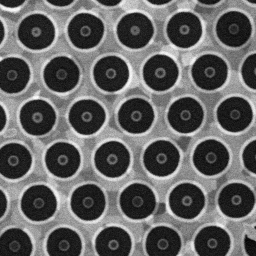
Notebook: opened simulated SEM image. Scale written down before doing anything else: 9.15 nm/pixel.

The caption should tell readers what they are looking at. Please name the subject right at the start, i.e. an array of small figures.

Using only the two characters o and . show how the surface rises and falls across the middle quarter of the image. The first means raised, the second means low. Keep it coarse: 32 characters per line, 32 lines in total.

....ooo.........ooo..........ooo
....ooo..........oo..........oo.
o...ooo....oo....oo....oo....oo.
....ooo..........oo..........ooo
....ooo.........oooo........oooo
...ooooo........oooo........oooo
..ooooooo......ooooooo.....ooooo
oooooooooooooooooooooooooooooooo
oooo...ooooooooo....oooooooo....
oo.......oooooo.......ooooo.....
oo........oooo........oooo......
o.........ooo..........ooo......
o....o.....oo....oo....ooo....o.
o....o.....oo....oo....oo.....o.
o..........oo..........ooo......
oo........oooo........oooo......
oo.......oooooo......oooooo.....
ooo.....oooooooo....ooooooooo...
oooooooooooooooooooooooo.ooooooo
.ooooooooo....oooooooo.....ooooo
...oooooo.......ooooo.......oooo
....oooo........oooo.........ooo
....ooo..........ooo.........ooo
.....oo....oo....oo.....o....ooo
....ooo.....o....oo..........ooo
....ooo..........ooo.........ooo
....oooo........oooo........oooo
...oooooo......oooooo......ooooo
..ooooooooo...oooooooooo.ooooooo
ooooooooooooooooo..oooooooooo...
ooo......ooooooo.....ooooooo....
oo........oooo........ooooo.....